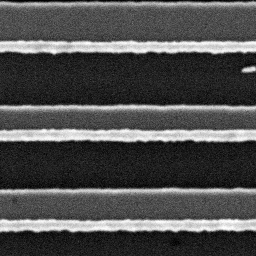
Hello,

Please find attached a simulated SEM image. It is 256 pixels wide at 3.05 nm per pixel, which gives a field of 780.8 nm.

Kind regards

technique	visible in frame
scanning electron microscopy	lines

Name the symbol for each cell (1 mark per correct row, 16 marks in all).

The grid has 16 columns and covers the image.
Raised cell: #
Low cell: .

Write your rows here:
################
################
################
................
................
................
................
################
################
................
................
................
################
################
................
................